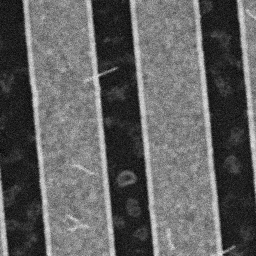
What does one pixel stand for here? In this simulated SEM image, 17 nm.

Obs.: one or a few lines or trenches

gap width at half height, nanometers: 737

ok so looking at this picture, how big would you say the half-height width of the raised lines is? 1080 nm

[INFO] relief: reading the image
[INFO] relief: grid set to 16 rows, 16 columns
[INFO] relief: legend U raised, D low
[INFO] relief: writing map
DDUUUUDDUUUUDDDU
DDUUUUDDUUUUDDDU
DDUUUUDDUUUUDDDU
DDUUUUDDDUUUUDDU
DDUUUUDDDUUUUDDU
DDUUUUDDDUUUUDDD
DDUUUUDDDUUUUDDD
DDUUUUDDDUUUUDDD
DDUUUUDDDUUUUDDD
DDUUUUDDDUUUUDDD
DDDUUUUDDUUUUDDD
DDDUUUUDDUUUUDDD
DDDUUUUDDUUUUDDD
DDDUUUUDDDUUUUDD
DDDUUUUDDDUUUUDD
DDDUUUUDDDUUUUDD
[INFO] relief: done